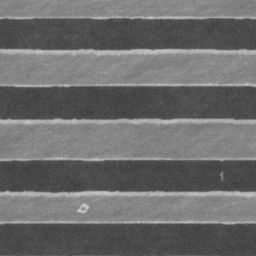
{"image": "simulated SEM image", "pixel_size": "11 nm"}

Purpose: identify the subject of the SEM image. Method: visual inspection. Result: lines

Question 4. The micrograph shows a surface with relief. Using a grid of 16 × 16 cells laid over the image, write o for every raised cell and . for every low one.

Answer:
oooooooooooooooo
................
................
oooooooooooooooo
oooooooooooooooo
................
................
................
oooooooooooooooo
oooooooooooooooo
................
................
oooooooooooooooo
oooooooooooooooo
................
................